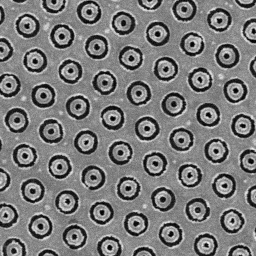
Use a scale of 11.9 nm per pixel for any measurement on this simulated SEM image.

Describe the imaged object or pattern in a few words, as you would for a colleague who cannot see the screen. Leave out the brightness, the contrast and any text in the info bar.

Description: a regular array of ring-shaped grooves with a dot in the middle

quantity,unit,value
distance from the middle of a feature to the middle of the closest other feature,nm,420